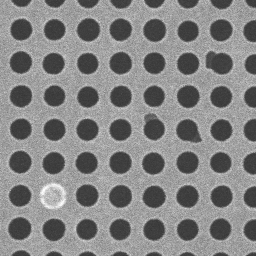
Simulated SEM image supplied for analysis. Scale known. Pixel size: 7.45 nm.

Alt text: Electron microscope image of a regular array of holes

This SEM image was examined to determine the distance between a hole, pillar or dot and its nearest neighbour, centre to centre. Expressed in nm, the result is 244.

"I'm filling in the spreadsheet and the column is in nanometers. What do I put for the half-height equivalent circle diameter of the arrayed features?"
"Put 167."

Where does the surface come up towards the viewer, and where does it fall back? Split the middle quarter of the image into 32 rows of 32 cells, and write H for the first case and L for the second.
HHHLLLLLLHHLLLLLLHHHLLLLLHHHLLLL
HHHHLLLLHHHHLLLLLHHHLLLLLHHHHLLL
HHHHHLLHHHHHHLLHHHHHHHLLHHHHHHLL
HHHHHHHHHHHHHHHHHHHHHHHHHHHHHHHH
HHHHHHHHHHHHHHHHHHHHHHHHHHHHHHHH
HHHHHHHHHHHHHHLHHHHHHHLHHHHHHHLL
HHHHLLLLHHHHLLLLLHHHLLLLLHHHHLLL
HHHLLLLLLHHLLLLLLHHHLLLLLHHHLLLL
HHHLLLLLLHHLLLLLLHHHLLLLLHHHLLLL
HHHHLLLLHHHHLLLLLHHHLLLLLHHHLLLL
HHHHLLLHHHHHHLLLHHHHHHLLHHHHHLLL
HHHHHHHHHHHHHHHHHHHHHHHHHHHHHHHH
HHHHHHHHHHHHHHHHHHHHHHHHHHHHHHHH
HHHHHHHHHHHHHHHHHHHHHHHHHHHHHHHH
HHHHLLLLHHHHLLLLHHHHHLLLLHHHHLLL
HHHLLLLLLHHLLLLLLHHHLLLLLHHHLLLL
HHHLLLLLLHHLLLLLLHHHLLLLLHHHLLLL
HHHLLLLLLHHLLLLLLHHHLLLLLHHHLLLL
HHHHLLLLHHHHLLLLHHHHHLLLHHHHHLLL
HHHHHHHHHHHHHHHHHHHHHHHHHHHHHHHL
HHHHHHHHHHHHHHHHHHHHHHHHHHHHHHHH
HHHHHHHHHHHHHHHHHHHHHHHHHHHHHHHH
HHHHLLLHHHHHLLLLHHHHHLLLHHHHHLLL
HHHLLLLLHHHHLLLLLHHHLLLLLHHHLLLL
HHHLLLLLLHHLLLLLLHHHLLLLLHHHLLLL
HHHLLLLLHHHLLLLLLHHHLLLLLHHHLLLL
HHHLLLLLHHHHLLLLHHHHLLLLLHHHHLLL
HHHHHLHHHHHHHLLHHHHHHLLHHHHHHHHH
HHHHHHHHHHHHHHHHHHHHHHHHHHHHHHHH
HHHHHHHHHHHHHHHHHHHHHHHHHHHHHHHH
HHHHLLLHHHHHHLLLHHHHHHLLHHHHHHLL
HHHLLLLLHHHHLLLLLHHHLLLLLHHHHLLL